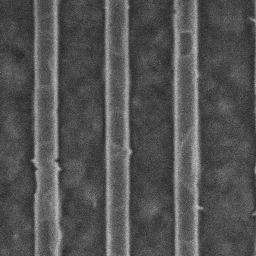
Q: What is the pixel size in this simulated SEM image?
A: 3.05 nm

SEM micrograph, one or a few lines or trenches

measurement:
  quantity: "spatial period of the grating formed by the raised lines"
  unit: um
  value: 0.213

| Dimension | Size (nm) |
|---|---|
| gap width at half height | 151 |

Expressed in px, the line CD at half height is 21.1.